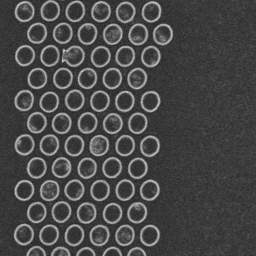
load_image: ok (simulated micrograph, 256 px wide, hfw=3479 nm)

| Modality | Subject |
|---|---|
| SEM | a regular array of raised bodies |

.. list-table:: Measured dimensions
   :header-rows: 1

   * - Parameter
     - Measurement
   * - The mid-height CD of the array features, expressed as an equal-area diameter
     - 255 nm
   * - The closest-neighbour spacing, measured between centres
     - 337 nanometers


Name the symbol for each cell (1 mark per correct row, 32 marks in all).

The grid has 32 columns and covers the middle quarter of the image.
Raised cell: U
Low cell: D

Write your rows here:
DDDDDDDDDDDDDDDUDDDDDUDDDDDDDDDD
UDDDDUUDDDDUUDDDDUUUDDDDDDDDDDDD
UUDDUUUUDDUUUUDDUUUUDDDDDDDDDDDD
UUDDUUUUDDUUUUDDUUUUDDDDDDDDDDDD
UUDDUUUUDDUUUUDDUUUUDDDDDDDDDDDD
UDDDUUUDDDDUUDDDDUUUDDDDDDDDDDDD
DDDDDDDDDDDDDDDDDDDDDDDDDDDDDDDD
DUUUDDDDUUUDDDUUUDDDUUUDDDDDDDDD
DUUUUDDUUUUDDUUUUDDDUUUUDDDDDDDD
DUUUUDDUUUUDDUUUUDDDUUUUDDDDDDDD
DUUUDDDUUUUDDUUUUDDDUUUDDDDDDDDD
DDDDDDDDUUDDDDUUDDDDUUUDDDDDDDDD
DDDDDUUDDDDDDDDDDDUDDDDDDDDDDDDD
UDDDUUUUDDDUUUDDDUUUDDDDDDDDDDDD
UUDDUUUUDDUUUUDDUUUUUDDDDDDDDDDD
UUDDUUUUDDUUUUDDUUUUDDDDDDDDDDDD
UDDDUUUDDDUUUUDDDUUUDDDDDDDDDDDD
DDDDDDDDDDDDDDDDDDDDDDDDDDDDDDDD
DUUUDDDUUUDDDDUUUDDDDUUDDDDDDDDD
DUUUUDDUUUUDDUUUUDDDUUUDDDDDDDDD
UUUUUDDUUUUDDUUUUUDUUUUUDDDDDDDD
DUUUUDDUUUUDDUUUUDDUUUUDDDDDDDDD
DUUUDDDDUUDDDDUUDDDDUUUDDDDDDDDD
DDDDDDDDDDDDDDDDDDDDDDDDDDDDDDDD
UDDDUUUUDDUUUUDDDUUUDDDDDDDDDDDD
UDDDUUUUDDUUUUDDUUUUUDDDDDDDDDDD
UDDDUUUUDDUUUUDDUUUUUDDDDDDDDDDD
UDDDUUUDDDUUUUDDDUUUDDDDDDDDDDDD
DDDDDDDDDDDDDDDDDDDDDDDDDDDDDDDD
DUUUDDDDUUDDDDUUUDDDDUUDDDDDDDDD
DUUUUDDUUUUDDUUUUDDUUUUDDDDDDDDD
UUUUUDDUUUUDDUUUUDDUUUUUDDDDDDDD